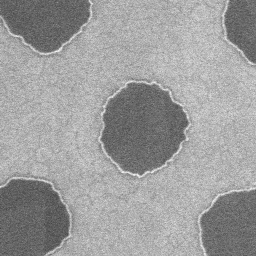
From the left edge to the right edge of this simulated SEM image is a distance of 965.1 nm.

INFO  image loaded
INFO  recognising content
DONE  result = raised bodies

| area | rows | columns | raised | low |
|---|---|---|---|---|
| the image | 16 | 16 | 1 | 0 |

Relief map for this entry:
1111110000000011
1111100000000011
0111000000000011
0000000000000001
0000000000000000
0000000011000000
0000000111100000
0000001111110000
0000001111110000
0000000111100000
0000000111000000
1110000000000000
1111000000000111
1111000000000111
1111000000001111
1111000000000111